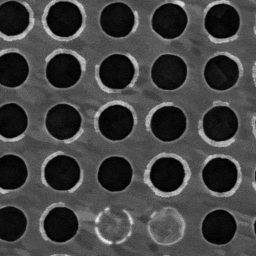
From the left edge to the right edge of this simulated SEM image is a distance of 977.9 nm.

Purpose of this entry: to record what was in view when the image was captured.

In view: a regular array of holes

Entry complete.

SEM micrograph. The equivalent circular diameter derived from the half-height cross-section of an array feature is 137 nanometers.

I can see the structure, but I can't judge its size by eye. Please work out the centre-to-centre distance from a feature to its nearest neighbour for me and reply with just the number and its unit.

0.195 microns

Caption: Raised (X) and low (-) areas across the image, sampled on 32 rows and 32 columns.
---XXXX--XXXXX--XXXXX-XXXXXXXXXX
----XX----XXX----XX----XXX----XX
----XX----XX-----XX----XXX----XX
---XXX----XXX----XX----XXX----XX
XXXXXXX--XXXXX--XXXX--XXXXX--XXX
XXXXXXXXXXXXXXXXXXXXXXXXXXXXXXXX
XXXXXXXXXXXXXXXXXXXXXXXXXXXXXXXX
---XXX----XXX---XXXX---XXX---XXX
----XX----XX-----XX----XXX----XX
---XXX----XX-----XX----XX-----XX
---XXX---XXXX---XXX----XXX---XXX
XXXXXXXXXXXXXXXXXXXXXXXXXXXXXXXX
XXXXXXXXXXXXXXXXXXXXXXXXXXXXXXXX
---XXX---XXXX---XXXX--XXXXX--XXX
---XXX----XX-----XX----XXX----XX
---XXX----XX-----XX----XX-----XX
---XXX----XXX---XXX----XX----XXX
XXXXXXXXXXXXXX-XXXXX--XXXX--XXXX
XXXXXXXXXXXXXXXXXXXXXXXXXXXXXXXX
--XXXXX-XXXXXXXXXXXXXXXXXXXXXXXX
---XXX----XXX---XXX----XXX---XXX
---XX-----XX-----XX----XX-----XX
---XXX----XX----XXX----XX-----XX
--XXXX---XXXX---XXXX--XXXX---XXX
XXXXXXXXXXXXXXXXXXXXXXXXXXXXXXXX
XXXXXXXXXXXXXXXXXXXXXXXXXXXXXXXX
---XXX---XXXXXXXXXXXXXXXXX---XXX
---XXX----XXXXXXXXXXXXXXX----XXX
---XXX----XXXXXXXXXXXXXXX-----XX
---XXX---XXXXXXXXXXXXXXXX----XXX
XXXXXXXXXXXXXXXXXXXXXXXXXXX-XXXX
XXXXXXXXXXXXXXXXXXXXXXXXXXXXXXXX